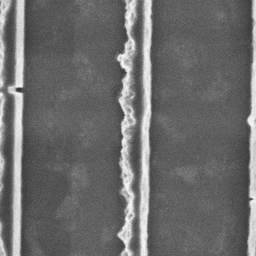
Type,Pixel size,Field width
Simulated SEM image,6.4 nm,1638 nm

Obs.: one or a few lines or trenches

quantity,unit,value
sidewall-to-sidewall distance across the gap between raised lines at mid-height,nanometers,695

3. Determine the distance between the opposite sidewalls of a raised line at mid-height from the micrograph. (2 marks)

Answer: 118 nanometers